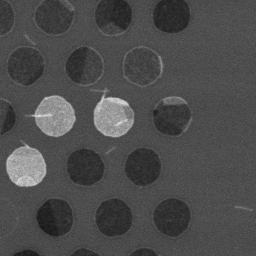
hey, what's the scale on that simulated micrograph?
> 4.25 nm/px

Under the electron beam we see a regular array of raised bodies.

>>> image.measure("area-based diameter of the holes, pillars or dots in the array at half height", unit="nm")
168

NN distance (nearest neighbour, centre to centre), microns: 0.246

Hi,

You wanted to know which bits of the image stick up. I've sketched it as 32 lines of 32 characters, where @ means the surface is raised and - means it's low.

@----@@@@---@@@@----@@@@--------
@@--@@@@@---@@@@@--@@@@@--------
@@--@@@@@---@@@@@--@@@@@--------
@@---@@@@---@@@@----@@@---------
--------------------------------
--------------------------------
--@@@----@@@----@@@-------------
-@@@@@--@@@@@--@@@@@------------
-@@@@@--@@@@@--@@@@@------------
-@@@@---@@@@@---@@@@------------
--@@------@@-----@@-------------
--------------------------------
@----@@@-----@@-----@@@---------
@@---@@@@---@@@@---@@@@@--------
@@--@@@@@---@@@@@--@@@@@--------
@@---@@@@---@@@@---@@@@@--------
@-----@@-----@@@----@@@---------
--------------------------------
--@@------@------@@-------------
-@@@@----@@@@---@@@@------------
-@@@@@--@@@@@---@@@@------------
-@@@@@--@@@@@---@@@@------------
-@@-@----@@@@---@@@@------------
--------------------------------
--------------------------------
-----@@@@----@@@----@@@---------
-----@@@@---@@@@@--@@@@@--------
-----@@@@---@@@@@--@@@@@--------
-----@@@@---@@@@----@@@---------
------@@-----@@------@----------
--------------------------------
--@@@----@@@-----@@-------------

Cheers